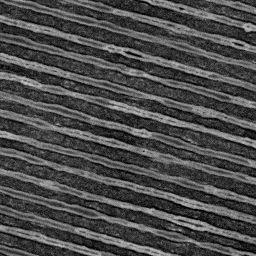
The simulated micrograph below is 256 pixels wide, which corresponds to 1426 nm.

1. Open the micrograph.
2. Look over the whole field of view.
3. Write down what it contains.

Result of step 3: parallel lines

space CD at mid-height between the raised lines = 13.2 pixels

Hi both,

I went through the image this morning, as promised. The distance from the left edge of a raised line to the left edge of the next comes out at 103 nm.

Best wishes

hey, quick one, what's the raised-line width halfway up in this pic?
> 0.0296 micrometres